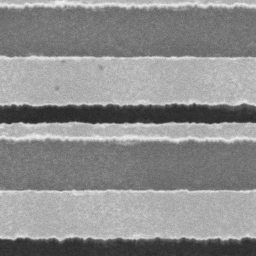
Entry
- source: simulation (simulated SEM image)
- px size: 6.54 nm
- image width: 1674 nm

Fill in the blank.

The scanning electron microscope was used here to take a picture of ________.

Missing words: lines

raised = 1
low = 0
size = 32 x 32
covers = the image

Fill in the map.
11111111011111111111111011111111
00000000000000000000000000000000
00000000000000000000000000000000
00000000000000000000000000000000
00000000000000000000000000000000
00000000000000000000000000000000
00000000000000000000000000000000
11111111111111111111111111111111
11111111111111111111111111111111
11111111111111111111111111111111
11111111111111111111111111111111
11111111111111111111111111111111
11111111111111111111111111111111
00000000000000000000000000000000
00000000000000000000000000000000
11111111111011111111111111111111
11111111111111111111111111111111
00000000000000000000000000000000
00000000000000000000000000000000
00000000000000000000000000000000
00000000000000000000000000000000
00000000000000000000000000000000
00000000000000000000000000000000
00000000000000000000000000000000
11111111111111111111111111111111
11111111111111111111111111111111
11111111111111111111111111111111
11111111111111111111111111111111
11111111111111111111111111111111
11111111111111111111111111111111
00000000000000000000000000000000
00000000000000000000000000000000